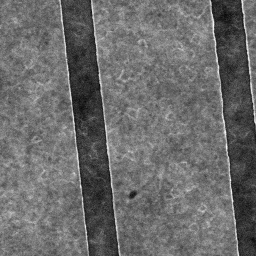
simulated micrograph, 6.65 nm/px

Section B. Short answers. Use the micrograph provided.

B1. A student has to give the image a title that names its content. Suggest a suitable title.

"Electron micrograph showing one or a few lines or trenches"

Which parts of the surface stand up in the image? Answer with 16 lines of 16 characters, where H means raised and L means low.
HHHHLLHHHHHHHLLH
HHHHLLHHHHHHHLLH
HHHHLLHHHHHHHLLH
HHHHLLHHHHHHHHLL
HHHHLLHHHHHHHHLL
HHHHLLHHHHHHHHLL
HHHHLLHHHHHHHHLL
HHHHHLLHHHHHHHLL
HHHHHLLHHHHHHHLL
HHHHHLLHHHHHHHLL
HHHHHLLHHHHHHHLL
HHHHHLLHHHHHHHLL
HHHHHLLHHHHHHHHL
HHHHHLLHHHHHHHHL
HHHHHLLHHHHHHHHL
HHHHHHLHHHHHHHHL